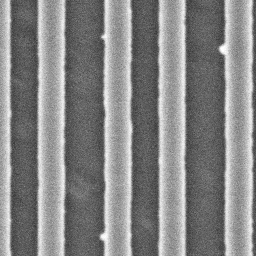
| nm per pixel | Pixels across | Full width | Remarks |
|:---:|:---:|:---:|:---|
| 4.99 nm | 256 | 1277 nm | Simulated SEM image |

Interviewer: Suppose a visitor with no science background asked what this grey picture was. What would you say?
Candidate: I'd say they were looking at lines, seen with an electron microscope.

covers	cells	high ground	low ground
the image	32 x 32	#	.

#....###.....###....###.....###.
#....###.....###....###.....###.
#....###.....###....###.....###.
#....###.....###....###.....###.
#....###.....###....###.....###.
#....###.....###....###.....###.
#....###.....###....###.....###.
#....###.....###....###.....###.
#....###.....###....###.....###.
#....###.....###....###.....###.
#....###.....###....###.....###.
#....###.....###....###.....###.
#....###.....###....###.....###.
#....###.....###....###.....###.
#....###.....###....###.....###.
#....###.....###....###.....###.
#....###.....###....###.....###.
#....###.....###....###.....###.
#....###.....###....###.....###.
#....###.....###....###.....###.
#....###.....###....###.....###.
#....###.....###....###.....###.
#....###.....###....###.....###.
#....###.....###....###.....###.
#....###.....###....###.....###.
#....###.....###....###.....###.
#....###.....###....###.....###.
#....###.....###....###.....###.
#....###.....###....###.....###.
#....###.....###....###.....###.
#....###.....###....###.....###.
#....###.....###....###.....###.